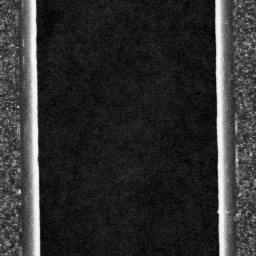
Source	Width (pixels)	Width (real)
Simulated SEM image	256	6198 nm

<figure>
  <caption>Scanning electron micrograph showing one or a few lines or trenches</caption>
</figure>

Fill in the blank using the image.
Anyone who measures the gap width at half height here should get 4460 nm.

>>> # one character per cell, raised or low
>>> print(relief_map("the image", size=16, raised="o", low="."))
oo............oo
oo............oo
oo............oo
oo............oo
oo............oo
oo............oo
oo............oo
oo............oo
oo............oo
oo............oo
oo............oo
oo............oo
oo............oo
oo............oo
oo............oo
oo............oo